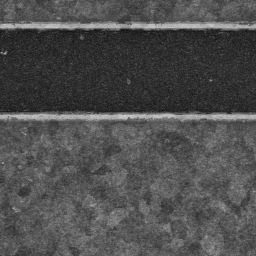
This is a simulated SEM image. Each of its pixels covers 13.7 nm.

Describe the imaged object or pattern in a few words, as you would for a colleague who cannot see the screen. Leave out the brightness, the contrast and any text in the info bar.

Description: one or a few lines or trenches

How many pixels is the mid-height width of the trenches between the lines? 91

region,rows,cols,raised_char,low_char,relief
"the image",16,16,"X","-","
XXXXXXXXXXXXXXXX
XXXXXXXXXXXXXXXX
----------------
----------------
----------------
----------------
----------------
XXXXXXXXXXXXXXXX
XXXXXXXXXXXXXXXX
XXXXXXXXXXXXXXXX
XXXXXXXXXXXXXXXX
XXXXXXXXXXXXXXXX
XXXXXXXXXXXXXXXX
XXXXXXXXXXXXXXXX
XXXXXXXXXXXXXXXX
XXXXXXXXXXXXXXXX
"